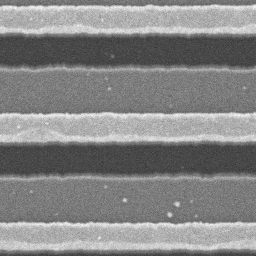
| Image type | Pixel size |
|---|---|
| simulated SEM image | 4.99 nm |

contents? lines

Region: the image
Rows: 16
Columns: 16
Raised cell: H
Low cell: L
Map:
HHHHHHHHHHHHHHHH
HHHHHHHHHHHHHHHH
LLLLLLLLLLLLLLLL
LLLLLLLLLLLLLLLL
HHHHHHHHHHHHHHHH
HHHHHHHHHHHHHHHH
HHHHHHHHHHHHHHHH
HHHHHHHHHHHHHHHH
HHHHHHHHHHHHHHHH
LLLLLLLLLLLLLLLL
LLLLLLLLLLLLLLLL
HHHHHHHHHHHHHHHH
HHHHHHHHHHHHHHHH
HHHHHHHHHHHHHHHH
HHHHHHHHHHHHHHHH
HHHHHHHHHHHHHHHH